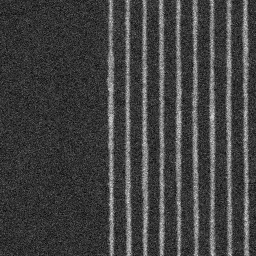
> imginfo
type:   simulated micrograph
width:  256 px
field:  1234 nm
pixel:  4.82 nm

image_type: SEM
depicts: parallel lines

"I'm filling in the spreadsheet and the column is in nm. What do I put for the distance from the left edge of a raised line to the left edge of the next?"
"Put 81.3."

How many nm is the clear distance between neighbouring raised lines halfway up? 66.3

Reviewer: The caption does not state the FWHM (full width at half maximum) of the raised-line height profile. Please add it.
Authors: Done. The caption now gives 14.5 nm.